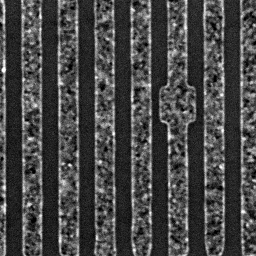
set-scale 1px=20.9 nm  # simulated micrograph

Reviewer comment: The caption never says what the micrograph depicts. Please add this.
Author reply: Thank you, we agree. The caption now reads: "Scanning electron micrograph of wiring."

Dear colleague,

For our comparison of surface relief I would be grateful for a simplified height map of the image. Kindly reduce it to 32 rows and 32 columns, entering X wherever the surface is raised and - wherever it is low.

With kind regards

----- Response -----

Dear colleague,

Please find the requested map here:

---XX--XXX--XX--XXX--XX---XX--XX
---XX--XXX--XX--XXX--XX---XX--XX
---XX--XXX--XX--XXX--XX---XX--XX
X--XX--XXX--XX--XXX--XX---XX--XX
X--XX--XXX--XX--XXX--XX---XX--XX
X--XX--XXX--XX--XXX--XX---XX--XX
X--XX--XXX--XX--XXX--XX---XX--XX
X--XX--XXX--XX--XXX--XX---XX--XX
X--XX--XXX--XX---XX--XX---XX--XX
X--XX--XXX--XX---XX--XX---XX--XX
X--XX--XXX--XX---XX--XXX--XX--XX
X--XX--XXX--XX---XX-XXXX--XX--XX
X--XX--XXX--XX---XX-XXXX--XX--XX
X--XX--XXX--XX---XX-XXXX--XX--XX
X--XX--XXX--XX---XX-XXXX--XX--XX
X--XX--XXX--XX---XX--XXX--XX--XX
X--XX--XXX--XX---XX--XX---XX--XX
X--XX--XXX--XX---XX--XX---XX--XX
X--XX--XXX--XX---XX--XX---XX--XX
X--XX--XXX--XX---XX--XX---XX--XX
X--XX--XXX--XX---XX--XX---XX--XX
X--XX--XXX--XX---XX--XX---XX--XX
X--XX--XXX--XX---XX--XX---XX--XX
X--XX--XXX--XX---XX--XX---XX--XX
X--XX--XXX--XX---XX--XX---XX--XX
X--XX--XXX--XX---XX--XX---XX--XX
X--XX--XXX--XX---XX--XX---XX--XX
X--XX--XXX--XX---XX--XX---XX--XX
X--XX--XXX--XX---XX--XX---XX--XX
X--XX--XXX--XX---XX--XX---XX--XX
X--XX--XXX--XX---XX--XX---XX--XX
X--XX---XX--XX---XX--XX---XX--XX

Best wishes